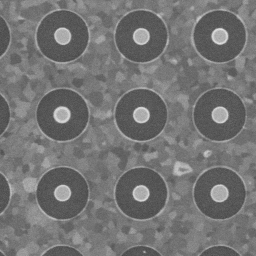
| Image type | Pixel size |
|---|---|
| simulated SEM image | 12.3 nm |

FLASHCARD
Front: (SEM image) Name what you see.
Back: an array of small figures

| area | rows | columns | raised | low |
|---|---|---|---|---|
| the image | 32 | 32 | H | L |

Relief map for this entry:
HHHHHHHHHHHHHHHHHHHHHHHHHHHHHHHH
HHHHHHLLLHHHHHHHLLLHHHHHHHLLLHHH
LHHHHLLLLLHHHHHLLLLLHHHHHLLLLLHH
LHHHHLLLLLLHHHLLLLLLLHHHLLLLLLLH
LHHHLLLHHLLHHHLLLHHLLHHHLLLHLLLH
LHHHHLLLLLLHHHLLLLLLLHHHLLLLLLLH
LHHHHLLLLLHHHHHLLLLLHHHHHLLLLLHH
HHHHHHLLLHHHHHHHLLLHHHHHHHLLLHHH
HHHHHHHHHHHHHHHHHHHHHHHHHHHHHHHH
HHHHHHHHHHHHHHHHHHHHHHHHHHHHHHHH
HHHHHHHHHHHHHHHHHHHHHHHHHHHHHHHH
HHHHHHLLLLHHHHHHLLLHHHHHHHLLLHHH
LHHHHLLLLLLHHHHLLLLLHHHHHLLLLLHH
LHHHHLLLLLLHHHLLLLLLLHHHLLLHLLLH
LHHHHLLHHLLHHHLLLHHLLHHHLLLHLLLH
LHHHHLLLLLLHHHLLLLLLLHHHLLLLLLLH
HHHHHLLLLLHHHHHLLLLLHHHHHLLLLLHH
HHHHHHHLLHHHHHHHHLLHHHHHHHLLLHHH
HHHHHHHHHHHHHHHHHHHHHHHHHHHHHHHH
HHHHHHHHHHHHHHHHHHHHHHHHHHHHHHHH
HHHHHHHHHHHHHHHHHHHHHHHHHHHHHHHH
HHHHHHLLLLHHHHHHLLLLHHHHHLLLLHHH
LHHHHLLLLLLHHHHLLLLLHHHHHLLLLLHH
LHHHHLLHHLLHHHLLLHLLLHHHLLLHLLLH
LHHHHLLHHLLHHHLLLHHLLHHHLLHHLLLH
LHHHHLLLLLLHHHHLLLLLLHHHLLLLLLHH
HHHHHLLLLLHHHHHLLLLLHHHHHLLLLLHH
HHHHHHHLHHHHHHHHHLHHHHHHHHHHHHHH
HHHHHHHHHHHHHHHHHHHHHHHHHHHHHHHH
HHHHHHHHHHHHHHHHHHHHHHHHHHHHHHHH
HHHHHHHHHHHHHHHHHHHHHHHHHHHHHHHH
HHHHHHLLLLHHHHHHLLLLHHHHHLLLLLHH